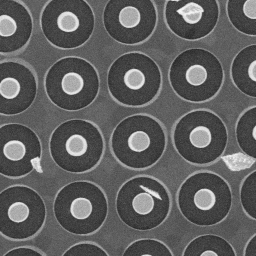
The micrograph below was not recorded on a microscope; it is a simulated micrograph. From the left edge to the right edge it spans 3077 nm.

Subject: an array of small figures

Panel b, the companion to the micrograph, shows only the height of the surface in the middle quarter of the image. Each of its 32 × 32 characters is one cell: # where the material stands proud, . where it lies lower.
.......#####...........####.....
........###.............##.....#
.##......##.....####....##.....#
####.....##....#####....##.....#
####.....##.....####....##.....#
####.....##.....###.....###.....
####.....##.............###.....
........####............####....
........####...........#######..
.......######.........##########
......##########...#############
....############################
###################.##########..
###############........######...
.......#######..........####....
........#####............###....
.........####............##.....
.........###.....###.....##.....
..##......##.....####.....#....#
.####.....##....#####.....#.....
.####.....##.....####....###....
.####.....##......##.....###....
..##......##.............####...
.........####...........######..
.........#####.........########.
........#######.......##########
.......###########.#############
################################
#################.....#########.
##....#########.........######..
........#######..........####...
..........####............###...